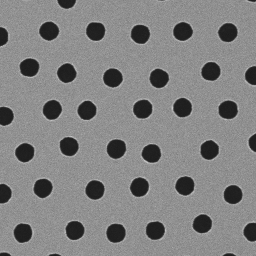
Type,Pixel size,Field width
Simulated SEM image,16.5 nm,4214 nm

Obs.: a regular array of holes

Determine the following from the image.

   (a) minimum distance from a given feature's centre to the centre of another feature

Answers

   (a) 0.67 micrometres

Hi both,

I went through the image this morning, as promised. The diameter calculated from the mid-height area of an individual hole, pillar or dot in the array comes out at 310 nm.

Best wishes